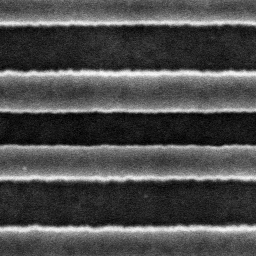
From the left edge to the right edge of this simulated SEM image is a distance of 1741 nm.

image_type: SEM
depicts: lines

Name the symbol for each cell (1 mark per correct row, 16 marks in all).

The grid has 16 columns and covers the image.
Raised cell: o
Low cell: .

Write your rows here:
oooooooooooooooo
................
................
................
................
oooooooooooooooo
oooooooooooooooo
................
................
oooooooooooooooo
oooooooooooooooo
................
................
................
oooooooooooooooo
oooooooooooooooo